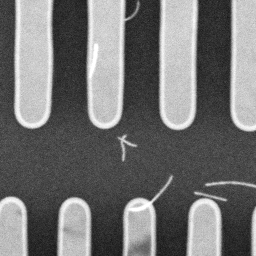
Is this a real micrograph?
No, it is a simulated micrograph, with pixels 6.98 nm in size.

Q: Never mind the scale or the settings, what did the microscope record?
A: groups of lines, slits or small figures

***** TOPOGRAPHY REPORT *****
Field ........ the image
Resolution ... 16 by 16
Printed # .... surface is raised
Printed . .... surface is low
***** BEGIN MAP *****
.##...##..##...#
.##...##..##...#
.##...##..##...#
.##...##..##...#
.##...##..##...#
.##...##..##...#
.##...##..##...#
.##...#...##...#
................
................
................
................
#...............
##..##..##..##..
##..##..##..##..
##..##..##..##..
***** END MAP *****